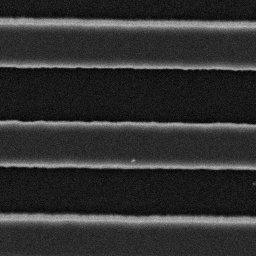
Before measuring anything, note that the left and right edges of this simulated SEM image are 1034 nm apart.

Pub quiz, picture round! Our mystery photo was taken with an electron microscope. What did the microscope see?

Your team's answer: lines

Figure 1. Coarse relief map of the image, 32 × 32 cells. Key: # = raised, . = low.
................................
................................
................................
################################
################################
################################
################################
################################
...................#############
................................
................................
................................
................................
................................
................................
#######################....#....
################################
################################
################################
################################
################################
................................
................................
................................
................................
................................
................................
################...#............
################################
################################
################################
################################